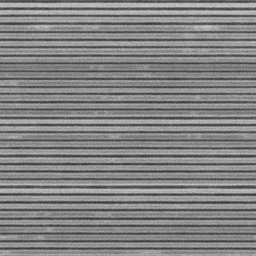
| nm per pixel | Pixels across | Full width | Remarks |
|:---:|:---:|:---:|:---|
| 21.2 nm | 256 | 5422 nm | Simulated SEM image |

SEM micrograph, parallel lines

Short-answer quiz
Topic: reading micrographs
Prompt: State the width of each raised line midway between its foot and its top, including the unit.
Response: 101 nm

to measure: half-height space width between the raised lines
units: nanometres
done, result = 60.9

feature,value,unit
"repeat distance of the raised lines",164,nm